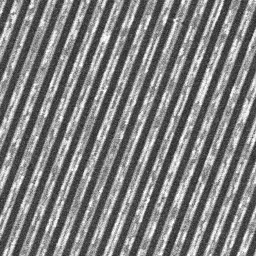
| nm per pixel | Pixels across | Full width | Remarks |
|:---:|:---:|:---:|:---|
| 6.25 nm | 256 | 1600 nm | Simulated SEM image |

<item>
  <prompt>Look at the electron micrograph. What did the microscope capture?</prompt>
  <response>parallel lines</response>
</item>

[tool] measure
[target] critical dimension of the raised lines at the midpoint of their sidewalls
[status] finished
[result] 46.9 nanometres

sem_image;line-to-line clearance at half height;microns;0.052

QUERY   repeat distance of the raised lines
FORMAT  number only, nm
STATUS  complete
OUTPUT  98.1